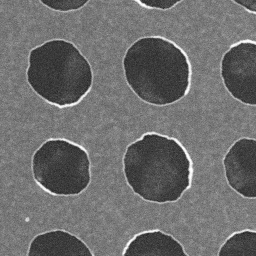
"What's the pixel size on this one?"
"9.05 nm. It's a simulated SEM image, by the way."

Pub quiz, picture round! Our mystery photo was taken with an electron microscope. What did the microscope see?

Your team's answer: holes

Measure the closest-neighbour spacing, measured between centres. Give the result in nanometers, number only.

860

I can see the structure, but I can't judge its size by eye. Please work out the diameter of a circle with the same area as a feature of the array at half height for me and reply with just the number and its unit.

587 nm